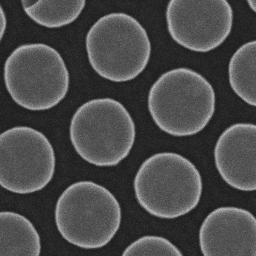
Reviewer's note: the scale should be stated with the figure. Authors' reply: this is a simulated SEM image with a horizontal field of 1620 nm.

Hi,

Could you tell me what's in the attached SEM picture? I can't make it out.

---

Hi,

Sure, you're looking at raised bodies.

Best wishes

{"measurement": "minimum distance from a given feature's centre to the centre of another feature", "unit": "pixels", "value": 84.5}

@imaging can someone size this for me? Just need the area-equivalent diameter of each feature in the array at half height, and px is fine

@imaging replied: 65.4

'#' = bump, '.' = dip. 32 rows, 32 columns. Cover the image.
...########..........#######...#
...#######...........########...
#...#####...#####....########...
#..........#######...########...
...........#######....######....
...........########....####....#
..#####....########...........##
.#######...#######...........###
.#######....######...........###
.#######.....####...#####....###
.#######...........#######...###
.#######...........########..###
..######....##.....########....#
...###....#####....########.....
.........#######...#######......
.........########...######......
.####....########....####...####
######...########..........#####
######...#######...........#####
#######...######...####....#####
#######.....##....######...#####
#######..........########..#####
######...........########...####
.####...#####....########.....##
........######...########.......
.......########...#######.......
.......########....####....####.
###....########...........######
####...########..........#######
#####...######...........#######
#####....####....####....#######
#####...........######...#######